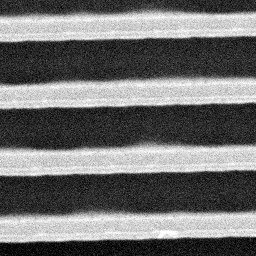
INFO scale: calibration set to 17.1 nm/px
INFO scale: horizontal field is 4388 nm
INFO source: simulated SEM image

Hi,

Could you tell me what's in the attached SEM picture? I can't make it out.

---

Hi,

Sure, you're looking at lines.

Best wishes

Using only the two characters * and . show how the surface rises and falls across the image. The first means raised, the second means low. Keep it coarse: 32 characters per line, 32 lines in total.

................................
................................
........************************
********************************
****************************....
................................
................................
................................
................................
................................
........................********
********************************
********************************
................................
................................
................................
................................
................................
................................
********************************
********************************
******************..............
................................
................................
................................
................................
................................
.........***********************
********************************
****************************....
................................
................................